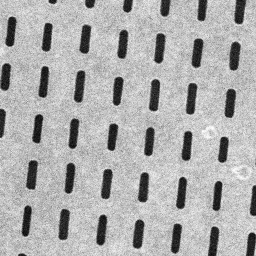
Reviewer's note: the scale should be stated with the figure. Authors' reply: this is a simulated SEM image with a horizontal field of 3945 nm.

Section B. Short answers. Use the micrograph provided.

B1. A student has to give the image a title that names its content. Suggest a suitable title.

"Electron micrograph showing a regular array of holes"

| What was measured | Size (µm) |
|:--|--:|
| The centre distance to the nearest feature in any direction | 0.573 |